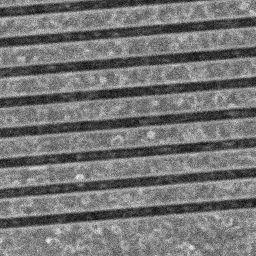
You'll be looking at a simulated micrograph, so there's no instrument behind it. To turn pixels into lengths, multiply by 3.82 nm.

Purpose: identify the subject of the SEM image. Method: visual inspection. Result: parallel lines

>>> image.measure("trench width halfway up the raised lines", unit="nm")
41.9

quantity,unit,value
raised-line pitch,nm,115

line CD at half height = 74.3 nm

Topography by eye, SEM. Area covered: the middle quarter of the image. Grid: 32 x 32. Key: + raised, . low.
......................++++++++++
..........++++++++++++++++++++++
++++++++++++++++++++++++++++++++
++++++++++++++++++++++++++++++++
+++++++++++++++++++++++++++++++.
+++++++++++++++++++.............
+++++++.........................
............................++++
..................++++++++++++++
....++++++++++++++++++++++++++++
++++++++++++++++++++++++++++++++
++++++++++++++++++++++++++++++++
++++++++++++++++++++++++........
++++++++++++....................
................................
.......................+++++++++
...........+++++++++++++++++++++
++++++++++++++++++++++++++++++++
++++++++++++++++++++++++++++++++
++++++++++++++++++++++++++++++++
++++++++++++++++++++............
++++++++........................
...............................+
...................+++++++++++++
.......+++++++++++++++++++++++++
++++++++++++++++++++++++++++++++
++++++++++++++++++++++++++++++++
+++++++++++++++++++++++++.......
+++++++++++++...................
+++.............................
.........................+++++++
.............+++++++++++++++++++